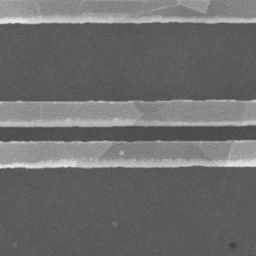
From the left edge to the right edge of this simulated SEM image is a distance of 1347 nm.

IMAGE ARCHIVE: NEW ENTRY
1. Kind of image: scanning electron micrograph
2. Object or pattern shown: lines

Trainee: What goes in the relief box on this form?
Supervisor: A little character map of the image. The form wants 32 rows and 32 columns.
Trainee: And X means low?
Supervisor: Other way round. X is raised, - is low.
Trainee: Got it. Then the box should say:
XXXXXXXXXXXXXXXXXXXXXXXXXXXXXXXX
XXXXXXXXXXXXXXXXXXXXXXXXXXXXXXXX
XXXXXXXXXXXXXXXXXXXXXXXXXXXXXXXX
--------------------------------
--------------------------------
--------------------------------
--------------------------------
--------------------------------
--------------------------------
--------------------------------
--------------------------------
--------------------------------
--------------------------------
XXXXXXXXXXXXXXXXXXXXXXXXXXXXXXXX
XXXXXXXXXXXXXXXXXXXXXXXXXXXXXXXX
XXXXXXX---XXXX----XXXXXXXXXX-XX-
--------------------------------
--------------------------------
XXXXXXXXXXXXXXXXXXXXXXXXXXXXXXXX
XXXXXXXXXXXXXXXXXXXXXXXXXXXXXXXX
XXXXXXXXXXXXXXXXXXXXXXXXXXXXXXXX
--------------------------------
--------------------------------
--------------------------------
--------------------------------
--------------------------------
--------------------------------
--------------------------------
--------------------------------
--------------------------------
--------------------------------
--------------------------------